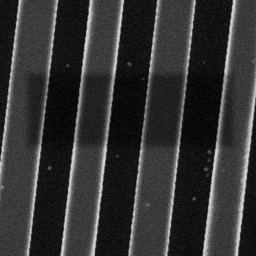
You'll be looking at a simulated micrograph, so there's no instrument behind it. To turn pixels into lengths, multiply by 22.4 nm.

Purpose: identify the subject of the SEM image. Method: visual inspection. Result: lines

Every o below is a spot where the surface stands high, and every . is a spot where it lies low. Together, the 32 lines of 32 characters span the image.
..ooooo....oooo.....oooo.....ooo
..ooooo....oooo.....oooo.....ooo
..ooooo....oooo....ooooo.....ooo
..ooooo....oooo....ooooo.....ooo
..ooooo....oooo....ooooo.....ooo
..ooooo....oooo....ooooo.....ooo
..oooo.....oooo....ooooo....oooo
..oooo....ooooo....ooooo....oooo
.ooooo....oooo.....ooooo....oooo
.ooooo....oooo.....oooo.....oooo
.ooooo....oooo.....oooo.....oooo
.ooooo....oooo....ooooo.....oooo
.ooooo....oooo....ooooo.....oooo
.ooooo....oooo....ooooo.....oooo
.ooooo....oooo....ooooo....ooooo
.oooo.....oooo....ooooo....ooooo
ooooo....oooo.....ooooo....oooo.
ooooo....oooo.....oooo.....oooo.
ooooo....oooo.....oooo.....oooo.
ooooo....oooo....ooooo.....oooo.
ooooo....oooo....ooooo.....oooo.
ooooo....oooo....ooooo.....oooo.
ooooo....oooo....ooooo.....oooo.
ooooo....oooo....ooooo....ooooo.
oooo....ooooo....ooooo....oooo..
oooo....ooooo....ooooo....oooo..
oooo....oooo.....oooo.....oooo..
oooo....oooo.....oooo.....oooo..
oooo....oooo....ooooo.....oooo..
oooo....oooo....ooooo.....oooo..
oooo....oooo....ooooo.....oooo..
oooo....oooo....ooooo....ooooo..